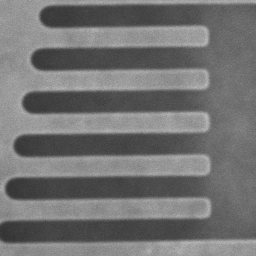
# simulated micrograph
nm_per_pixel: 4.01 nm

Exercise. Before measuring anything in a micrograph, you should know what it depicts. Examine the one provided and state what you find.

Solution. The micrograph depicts groups of lines, slits or small figures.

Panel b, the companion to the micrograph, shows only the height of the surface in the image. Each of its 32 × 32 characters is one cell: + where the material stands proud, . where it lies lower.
++++++++++++++..................
+++++...........................
+++++...........................
++++++...........+++++++++......
++++++++++++++++++++++++++......
++++++++++++++++++++++++++......
++++............................
++++............................
++++............................
++++++++++++++++++++++++++......
++++++++++++++++++++++++++......
++++............................
+++.............................
+++.............................
++++++++++++++++++++++++++......
++++++++++++++++++++++++++......
++++++++++++++++++++++..........
++..............................
++..............................
++.....................++.......
++++++++++++++++++++++++++......
++++++++++++++++++++++++++......
+...............................
+...............................
+...............................
++++++++++++++++++++++++++......
++++++++++++++++++++++++++......
++++............................
................................
................................
++++++++++++++++++++++++++++++++
++++++++++++++++++++++++++++++++